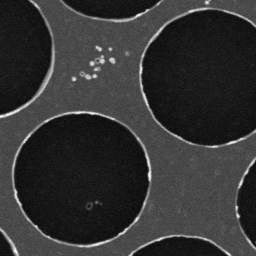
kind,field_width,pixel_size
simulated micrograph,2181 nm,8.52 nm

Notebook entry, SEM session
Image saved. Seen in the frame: holes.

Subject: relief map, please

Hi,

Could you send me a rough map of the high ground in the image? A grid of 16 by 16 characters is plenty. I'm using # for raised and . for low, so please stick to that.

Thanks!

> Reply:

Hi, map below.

..##.....#######
...########.....
...#######......
...######.......
...######.......
...######.......
..#######.......
###....###......
##......###....#
#........#######
#........#######
#........######.
#........######.
##.......######.
###.....#######.
.########.....##